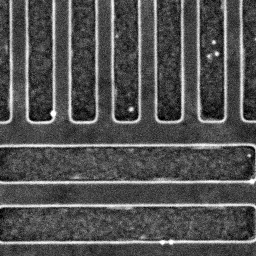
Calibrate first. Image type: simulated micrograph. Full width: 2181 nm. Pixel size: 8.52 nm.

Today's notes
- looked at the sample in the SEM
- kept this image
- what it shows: groups of lines, slits or small figures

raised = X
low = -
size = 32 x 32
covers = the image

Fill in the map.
-XX----XX---XX---XX----XX---XX--
-XX----XX---XX---XX----XX---XX--
-XX----XX---XX---XX----XX---XX--
-XX----XX---XX---XX----XX---XX--
-XX----XX---XX---XX----XX---XX--
-XX----XX---XX---XX----XX---XX--
-XX----XX---XX---XX----XX---XX--
-XX----XX---XX---XXX---XX---XX--
-XX----XX---XX---XXX---XX---XX--
-XX----XX---XX---XXX---XX---XX--
-XX----XX---XX---XXX---XX---XX--
-XX----XX---XX---XXX---XX---XX--
-XX----XX---XX---XXX---XX---XX--
-XX----XX---XX---XXX---XX---XX--
-XXX--XXX---XX---XXX---XX---XX--
XXXXXXXXXXXXXXXXXXXXXXXXXXXXXXXX
XXXXXXXXXXXXXXXXXXXXXXXXXXXXXXXX
XXXXXXXXXXXXXXXXXXXXXXXXXXXXXXXX
--------------------------------
--------------------------------
--------------------------------
--------------------------------
-------------------------------X
XXXXXXXXXXXXXXXXXXXXXXXXXXXXXXXX
XXXXXXXXXXXXXXXXXXXXXXXXXXXXXXXX
XXXXXXXXXXXXXXXXXXXXXXXXXXXXXXXX
--------------------------------
--------------------------------
--------------------------------
--------------------------------
XXXXXXXXXXXXXXXXXXXXXXXXXXXXXXXX
XXXXXXXXXXXXXXXXXXXXXXXXXXXXXXXX